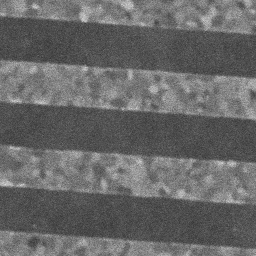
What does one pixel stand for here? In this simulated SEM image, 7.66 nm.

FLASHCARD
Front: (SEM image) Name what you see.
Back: one or a few lines or trenches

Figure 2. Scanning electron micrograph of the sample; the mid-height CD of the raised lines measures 0.302 um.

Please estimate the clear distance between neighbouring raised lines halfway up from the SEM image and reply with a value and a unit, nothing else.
352 nm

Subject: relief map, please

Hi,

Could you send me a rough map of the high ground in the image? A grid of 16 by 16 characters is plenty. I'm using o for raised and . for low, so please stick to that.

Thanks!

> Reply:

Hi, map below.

oooooooooooooooo
........oooooooo
................
................
oooooooooo......
oooooooooooooooo
...ooooooooooooo
................
................
ooooo...........
oooooooooooooooo
oooooooooooooooo
.............ooo
................
................
ooooooooooooooo.